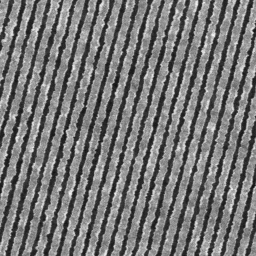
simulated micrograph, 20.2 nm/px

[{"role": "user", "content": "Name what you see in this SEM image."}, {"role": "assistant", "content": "parallel lines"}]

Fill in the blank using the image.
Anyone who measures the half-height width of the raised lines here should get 144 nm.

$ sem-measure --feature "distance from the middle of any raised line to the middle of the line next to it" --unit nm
247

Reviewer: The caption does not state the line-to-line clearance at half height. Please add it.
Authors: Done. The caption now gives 0.105 um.